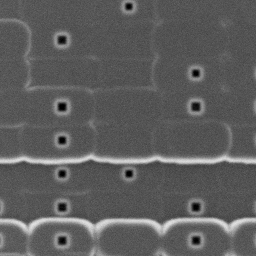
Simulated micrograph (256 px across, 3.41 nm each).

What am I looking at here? wiring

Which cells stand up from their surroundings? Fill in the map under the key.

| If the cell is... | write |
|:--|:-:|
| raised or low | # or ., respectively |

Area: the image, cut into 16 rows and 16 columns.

################
################
################
################
################
################
################
################
################
################
................
................
................
................
################
################